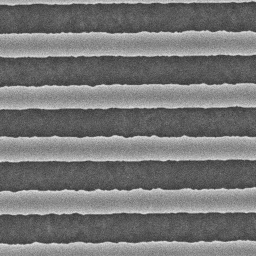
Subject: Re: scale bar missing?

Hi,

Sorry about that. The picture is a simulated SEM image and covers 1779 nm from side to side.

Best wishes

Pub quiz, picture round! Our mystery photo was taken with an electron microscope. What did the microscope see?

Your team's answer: lines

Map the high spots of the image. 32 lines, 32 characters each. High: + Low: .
++++.++++.++....................
................................
................................
................................
++++++++++++++++++++++++++++++++
++++++++++++++++++++++++++++++++
++++++++++++++++++++++++++++++++
................................
................................
................................
.........................+..++++
++++++++++++++++++++++++++++++++
++++++++++++++++++++++++++++++++
++++.+++..+++...................
................................
................................
................................
++++++++++++++++++++++++++++++++
++++++++++++++++++++++++++++++++
++++++++++++++++++++++++++++++++
................................
................................
................................
...............................+
++++++++++++++++++++++++++++++++
++++++++++++++++++++++++++++++++
++++++++++++++++++++++++++.++++.
................................
................................
................................
....++++++++++++++++++++++++++++
++++++++++++++++++++++++++++++++